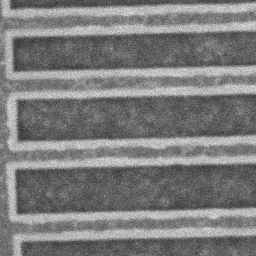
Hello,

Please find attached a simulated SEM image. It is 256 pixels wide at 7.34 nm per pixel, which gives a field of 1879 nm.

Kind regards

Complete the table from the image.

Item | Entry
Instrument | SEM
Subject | one or a few lines or trenches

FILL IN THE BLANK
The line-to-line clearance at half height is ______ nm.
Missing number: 368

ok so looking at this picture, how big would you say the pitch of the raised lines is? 501 nm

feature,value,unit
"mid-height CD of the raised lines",150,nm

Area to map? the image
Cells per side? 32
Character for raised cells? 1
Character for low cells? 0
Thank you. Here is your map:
10000000000000000000000000000000
10000000001111111111111111111111
11111111111111111111111111111111
11111111111111111111111011100000
10000000000000000000000000000000
10000000000000000000000000000000
10000000000000000000000000000000
10000000000000000000000000000000
10000000000000000000000000000000
11111111111111111111111111111111
11111111111111111111111111111111
11111111111111111100000000000000
11000000000000000000000000000000
11000000000000000000000000000000
11000000000000000000000000000000
11000000000000000000000000000000
11000000000000000000000000000000
11000000000000000000000000000000
11111111111111111111111111111111
11111111111111111111111111111111
11111111110000000000000000000000
10000000000000000000000000000000
11000000000000000000000000000000
11000000000000000000000000000000
11000000000000000000000000000000
10000000000000000000000000000000
11000000000000000000000000000001
11111111111111111111111111111111
11111111111111111111111111111111
11111111110000000000000000000000
11000000000000000000000000000000
11000000000000000000000000000000